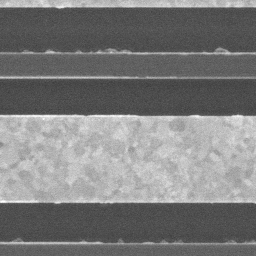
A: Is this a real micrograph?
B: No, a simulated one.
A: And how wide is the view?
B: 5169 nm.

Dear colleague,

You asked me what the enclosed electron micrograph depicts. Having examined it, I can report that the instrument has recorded lines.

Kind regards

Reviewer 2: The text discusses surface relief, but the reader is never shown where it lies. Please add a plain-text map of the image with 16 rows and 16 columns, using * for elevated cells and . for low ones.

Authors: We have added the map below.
................
................
................
****************
****************
................
................
****************
****************
****************
****************
****************
****************
................
................
****************